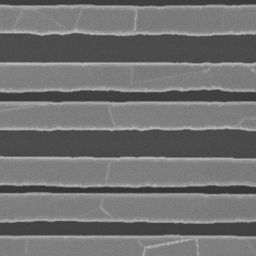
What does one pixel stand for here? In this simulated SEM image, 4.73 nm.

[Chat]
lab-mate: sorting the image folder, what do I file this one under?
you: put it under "lines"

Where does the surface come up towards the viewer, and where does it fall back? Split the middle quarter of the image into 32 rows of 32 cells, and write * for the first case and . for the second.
********************************
********************************
********************************
********************************
********************************
********************************
****........***************..**.
................................
................................
................................
********************************
********************************
********************************
********************************
********************************
********************************
................................
................................
................................
................................
................................
................................
................................
...****............**...........
********************************
********************************
********************************
********************************
********************************
********************************
**********.**********.*********.
................................